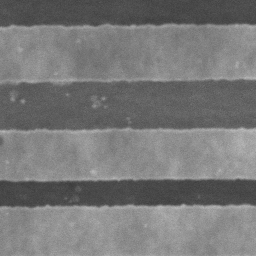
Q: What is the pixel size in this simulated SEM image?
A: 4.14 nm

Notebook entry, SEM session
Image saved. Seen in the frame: lines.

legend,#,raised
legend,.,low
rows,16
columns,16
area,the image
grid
................
................
################
################
################
................
................
................
################
################
################
................
................
################
################
################